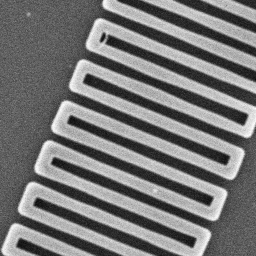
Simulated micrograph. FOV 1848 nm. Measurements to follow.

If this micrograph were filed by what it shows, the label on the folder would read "groups of lines, slits or small figures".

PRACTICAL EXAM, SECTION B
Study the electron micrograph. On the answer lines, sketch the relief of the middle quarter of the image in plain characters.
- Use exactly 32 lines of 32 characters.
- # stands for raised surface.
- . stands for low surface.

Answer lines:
...#####........#######........#
...########........#######......
...###.######........#######....
..###....#######.......#######..
..###......#######........######
..####........#######........###
..######........########........
....#######.......########......
.......#######.......#######....
.........#######.......#######..
####........#######.......######
######........#######.......####
#########.......#######........#
#...#######........######.......
#.....########.......#######....
##.......#######........######..
####.......#######........######
#######.......#######........###
.########.......#######........#
....#######........#######......
......########.......#######....
##.......#######........#######.
####........######........######
######........#######........###
..#######........######........#
....#######........######.......
.......#######........######....
#........#######........######..
####........######........######
######........#######........###
..#######.......#######........#
.....######........#######......